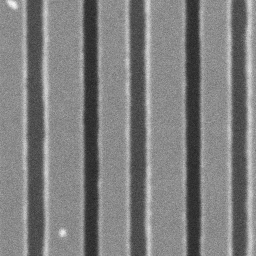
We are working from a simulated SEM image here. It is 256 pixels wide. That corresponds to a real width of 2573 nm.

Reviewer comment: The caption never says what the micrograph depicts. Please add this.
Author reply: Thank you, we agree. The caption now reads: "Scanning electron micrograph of lines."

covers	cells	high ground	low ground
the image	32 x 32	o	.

ooo...oooo..oooo..ooooo..oooo..o
ooo...oooo..oooo..ooooo..oooo..o
ooo...oooo..oooo..ooooo..oooo..o
ooo...oooo..oooo..ooooo..oooo..o
ooo...oooo..oooo..ooooo..oooo..o
ooo...oooo..oooo..ooooo..oooo..o
ooo...oooo..oooo..ooooo..oooo..o
ooo...oooo..oooo..ooooo..oooo..o
ooo...oooo..oooo..ooooo..oooo..o
ooo...oooo..oooo..ooooo..oooo..o
ooo...oooo..oooo..ooooo..oooo..o
ooo...oooo..oooo..ooooo..oooo..o
ooo...oooo..oooo..ooooo..oooo..o
ooo...oooo..oooo..ooooo..oooo..o
ooo...oooo..oooo..ooooo..oooo..o
ooo...oooo..oooo..ooooo..oooo..o
ooo...oooo..oooo...oooo..oooo..o
ooo...oooo..oooo..ooooo..oooo..o
ooo...oooo..oooo..ooooo..oooo..o
ooo...oooo..oooo..ooooo..oooo..o
ooo...oooo..oooo...oooo..oooo..o
ooo...oooo..oooo...oooo..oooo..o
ooo...oooo..oooo..ooooo..oooo..o
ooo...oooo..oooo..ooooo..oooo..o
ooo...oooo..oooo...oooo..oooo..o
ooo...oooo..oooo..ooooo..oooo..o
ooo...oooo..oooo...oooo..oooo..o
ooo...oooo..oooo..ooooo..oooo..o
ooo...oooo..oooo..ooooo..oooo..o
ooo...oooo..oooo...oooo..oooo..o
ooo...oooo..oooo...oooo..oooo..o
ooo...oooo..oooo...oooo..oooo..o